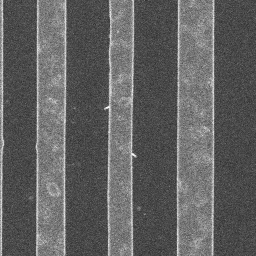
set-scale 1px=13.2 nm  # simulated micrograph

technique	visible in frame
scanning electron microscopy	one or a few lines or trenches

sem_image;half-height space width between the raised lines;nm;574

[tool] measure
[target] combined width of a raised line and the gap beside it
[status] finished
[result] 951 nm